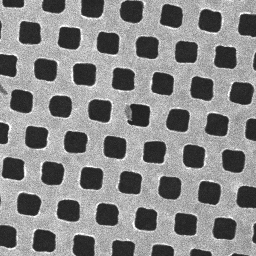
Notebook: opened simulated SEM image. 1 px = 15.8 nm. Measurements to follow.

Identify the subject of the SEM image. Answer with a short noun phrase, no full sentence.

a regular array of holes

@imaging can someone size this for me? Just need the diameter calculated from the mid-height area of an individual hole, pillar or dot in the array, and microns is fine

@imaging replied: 0.377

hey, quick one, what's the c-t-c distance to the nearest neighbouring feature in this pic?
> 0.613 micrometres